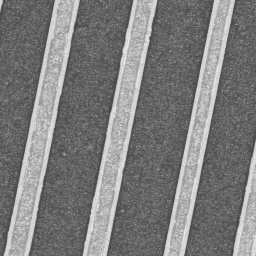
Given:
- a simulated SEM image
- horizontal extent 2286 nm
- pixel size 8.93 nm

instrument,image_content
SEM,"one or a few lines or trenches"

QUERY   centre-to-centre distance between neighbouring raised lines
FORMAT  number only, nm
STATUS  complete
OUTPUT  688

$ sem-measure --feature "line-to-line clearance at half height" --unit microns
0.512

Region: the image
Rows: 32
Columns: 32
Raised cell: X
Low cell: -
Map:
-------XXX-------XX--------XX---
-------XX--------XX--------XX---
-------XX-------XXX--------XX---
------XXX-------XXX-------XX----
------XXX-------XX--------XX----
------XXX-------XX--------XX----
------XX--------XX--------XX----
------XX-------XXX--------XX----
-----XXX-------XXX-------XX-----
-----XXX-------XX--------XX-----
-----XXX-------XX--------XX-----
-----XX--------XX--------XX-----
-----XX-------XXX--------XX-----
----XXX-------XXX-------XX------
----XXX-------XX--------XX------
----XXX-------XX--------XX------
----XX--------XX--------XX------
----XX-------XXX--------XX------
---XXX-------XXX-------XX-------
---XXX-------XX--------XX-------
---XXX-------XX--------XX-------
---XX--------XX--------XX------X
---XX-------XXX--------XX------X
--XXX-------XXX-------XX-------X
--XXX-------XX--------XX-------X
--XXX-------XX--------XX-------X
--XX--------XX--------XX------XX
--XX-------XXX--------XX------XX
-XXX-------XXX-------XX-------XX
-XXX-------XXX-------XX-------XX
-XXX-------XX--------XX-------XX
-XX--------XX--------XX------XXX